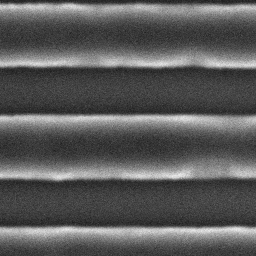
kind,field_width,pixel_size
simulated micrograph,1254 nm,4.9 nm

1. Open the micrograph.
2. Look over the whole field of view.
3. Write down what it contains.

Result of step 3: lines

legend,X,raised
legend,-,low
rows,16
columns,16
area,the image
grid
XXXXXXXXXXXXXXXX
XXXXXXXXXXXXXXXX
XXXXXXXXXXXXXXXX
XXXXXXXXXXXXXXXX
----------------
----------------
----------------
XXXXXXXXXXXXXXXX
XXXXXXXXXXXXXXXX
XXXXXXXXXXXXXXXX
XXXXXXXXXXXXXXXX
----------------
----------------
----------------
XXXXXXXXXXXXXXXX
XXXXXXXXXXXXXXXX